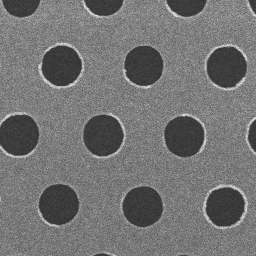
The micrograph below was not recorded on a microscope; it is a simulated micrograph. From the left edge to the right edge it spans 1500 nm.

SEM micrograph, a regular array of holes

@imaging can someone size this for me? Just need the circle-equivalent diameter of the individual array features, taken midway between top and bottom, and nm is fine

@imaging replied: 237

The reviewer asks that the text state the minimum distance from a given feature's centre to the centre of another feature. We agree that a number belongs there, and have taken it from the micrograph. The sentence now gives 0.476 micrometres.